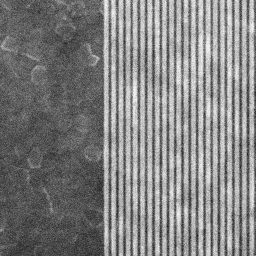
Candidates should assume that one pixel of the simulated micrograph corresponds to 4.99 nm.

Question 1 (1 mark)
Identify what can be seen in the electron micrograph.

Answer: parallel lines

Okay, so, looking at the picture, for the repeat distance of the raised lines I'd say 36.4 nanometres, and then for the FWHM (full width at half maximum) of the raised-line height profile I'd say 19.3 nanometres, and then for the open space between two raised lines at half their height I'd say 16.8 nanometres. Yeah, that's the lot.